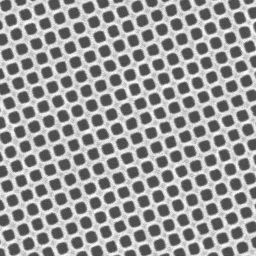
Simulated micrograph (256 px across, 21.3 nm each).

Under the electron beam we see a regular array of holes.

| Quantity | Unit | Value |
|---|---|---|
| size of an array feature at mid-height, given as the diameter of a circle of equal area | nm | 275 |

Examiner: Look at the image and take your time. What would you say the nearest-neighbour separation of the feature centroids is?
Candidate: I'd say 0.322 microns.